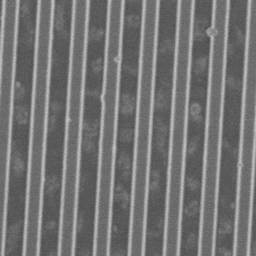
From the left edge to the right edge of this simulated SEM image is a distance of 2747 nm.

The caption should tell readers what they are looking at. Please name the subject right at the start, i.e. parallel lines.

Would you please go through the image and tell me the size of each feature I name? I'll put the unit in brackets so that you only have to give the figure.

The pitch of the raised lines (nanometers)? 375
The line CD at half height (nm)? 165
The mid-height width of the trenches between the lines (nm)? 217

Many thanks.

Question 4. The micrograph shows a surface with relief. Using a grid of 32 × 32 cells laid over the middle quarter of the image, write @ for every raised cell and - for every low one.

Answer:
--@@@-----@@@@-----@@@@-----@@@-
--@@@-----@@@@-----@@@@-----@@@-
-@@@@-----@@@@-----@@@------@@@-
-@@@@-----@@@@-----@@@------@@@-
-@@@@-----@@@@-----@@@------@@@-
-@@@@-----@@@@-----@@@------@@@-
-@@@@-----@@@@-----@@@------@@@-
-@@@@-----@@@------@@@-----@@@@-
-@@@@-----@@@-----@@@@-----@@@@-
-@@@------@@@-----@@@@-----@@@@-
-@@@------@@@-----@@@@-----@@@@-
-@@@------@@@-----@@@@-----@@@@-
-@@@------@@@-----@@@@-----@@@@-
-@@@------@@@-----@@@@-----@@@@-
-@@@-----@@@@-----@@@@-----@@@--
-@@@-----@@@@-----@@@@-----@@@--
-@@@-----@@@@-----@@@@-----@@@--
-@@@-----@@@@-----@@@@-----@@@--
-@@@-----@@@@-----@@@@-----@@@--
@@@@-----@@@@-----@@@------@@@--
@@@@-----@@@@-----@@@------@@@--
@@@@-----@@@@-----@@@------@@@--
@@@@-----@@@@-----@@@------@@@--
@@@@-----@@@@-----@@@------@@@--
@@@@-----@@@------@@@-----@@@@--
@@@@-----@@@-----@@@@-----@@@@--
@@@------@@@------@@@-----@@@@--
@@@------@@@-----@@@@-----@@@@--
@@@------@@@------@@@-----@@@@--
@@@------@@@-----@@@@-----@@@@--
@@@-----@@@@-----@@@@-----@@@---
@@@-----@@@@-----@@@@-----@@@---